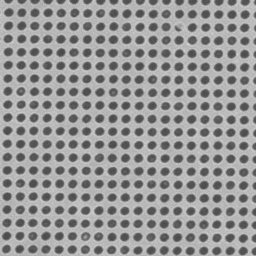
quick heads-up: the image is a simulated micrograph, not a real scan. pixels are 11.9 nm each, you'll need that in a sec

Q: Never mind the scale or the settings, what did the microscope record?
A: a regular array of holes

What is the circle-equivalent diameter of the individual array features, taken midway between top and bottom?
9.84 px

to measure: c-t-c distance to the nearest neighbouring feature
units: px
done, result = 12.7